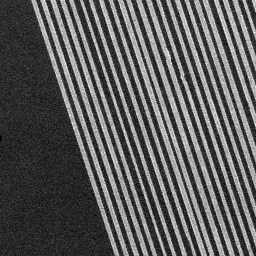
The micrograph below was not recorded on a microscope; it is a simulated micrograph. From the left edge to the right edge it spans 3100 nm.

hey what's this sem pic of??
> parallel lines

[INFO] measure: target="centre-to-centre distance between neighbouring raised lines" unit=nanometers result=110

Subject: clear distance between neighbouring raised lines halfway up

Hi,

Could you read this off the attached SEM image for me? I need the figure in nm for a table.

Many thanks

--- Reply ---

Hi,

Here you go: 69.1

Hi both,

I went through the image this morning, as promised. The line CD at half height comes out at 46.1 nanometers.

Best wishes